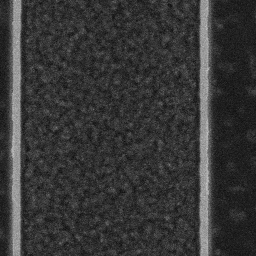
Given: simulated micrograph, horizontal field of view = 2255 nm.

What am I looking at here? one or a few lines or trenches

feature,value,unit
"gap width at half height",1650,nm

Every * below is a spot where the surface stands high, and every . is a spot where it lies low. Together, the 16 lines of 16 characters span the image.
*............***
*............***
*............***
*............***
*............***
*............***
*............***
*............***
*............***
*............***
*............***
*............***
*............***
*............***
*............***
*............***